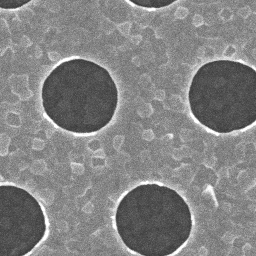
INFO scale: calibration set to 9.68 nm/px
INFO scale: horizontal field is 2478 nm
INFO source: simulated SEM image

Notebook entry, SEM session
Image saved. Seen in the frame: holes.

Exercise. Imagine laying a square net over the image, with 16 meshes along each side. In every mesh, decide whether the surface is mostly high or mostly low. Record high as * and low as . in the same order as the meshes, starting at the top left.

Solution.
.***************
****************
****************
****************
***....*****....
***....*****....
***....*****....
***....*****....
****************
****************
****************
****************
..******...*****
...****.....****
...****.....****
..******...*****